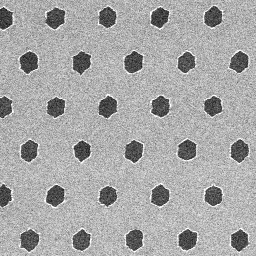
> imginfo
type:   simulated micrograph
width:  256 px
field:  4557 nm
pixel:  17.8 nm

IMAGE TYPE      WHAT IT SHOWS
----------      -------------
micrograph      a regular array of raised bodies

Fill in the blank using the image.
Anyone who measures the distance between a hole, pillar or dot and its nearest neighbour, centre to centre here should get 911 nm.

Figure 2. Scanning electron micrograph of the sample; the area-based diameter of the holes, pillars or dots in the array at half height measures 365 nm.